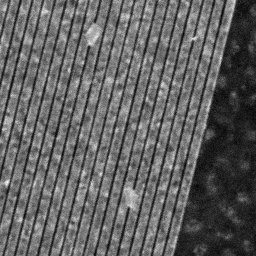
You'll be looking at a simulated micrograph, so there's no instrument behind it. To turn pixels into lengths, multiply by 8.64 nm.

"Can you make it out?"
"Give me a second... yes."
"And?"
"parallel lines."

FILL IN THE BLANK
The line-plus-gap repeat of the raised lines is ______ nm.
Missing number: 95.5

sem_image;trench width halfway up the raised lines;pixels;2.42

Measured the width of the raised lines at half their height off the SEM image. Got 74.5 nanometers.